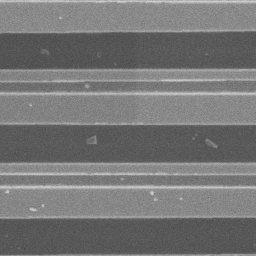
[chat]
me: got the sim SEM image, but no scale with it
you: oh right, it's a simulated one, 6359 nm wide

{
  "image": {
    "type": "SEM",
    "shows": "lines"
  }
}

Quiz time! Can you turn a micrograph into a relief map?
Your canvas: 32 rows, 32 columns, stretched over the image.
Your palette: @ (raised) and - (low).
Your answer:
@@@@@@@@@@@@@@@@@@@@@@@@@@@@@@@@
@@@@@@@@@@@@@@@@@@@@@@@@@@@@@@@@
@@@@@@@@@@@@@@@@@@@@@@@@@@@@@@@@
@@@@@@@@@@@@@@@@@@@@@@@@@@@@@@@@
--------------------------------
--------------------------------
--------------------------------
--------------------------------
--------------------------------
@@@@@@@@@@@@@@@@@@@@@@@@@@@@@@@@
@@@@@@@@@@@@@@@@@@@@@@@@@@@@@@@@
@@@@@@@@@@@@@@@@@@@@@@@@@@@@@@@@
@@@@@@@@@@@@@@@@@@@@@@@@@@@@@@@@
@@@@@@@@@@@@@@@@@@@@@@@@@@@@@@@@
@@@@@@@@@@@@@@@@@@@@@@@@@@@@@@@@
--------@@@@@@@@@@@@@@@@@@@@@@@@
--------------------------------
--------------------------------
--------------------------------
--------------------------------
--------------------------------
@@@@@@@@@@@@@@@@@@@@@@@@@@@@@@@@
@@@@@@@@@@@@@@@@@@@@@@@@@@@@@@@@
@@@@@@@@@@@@@@@@@@@@@@@@@@@@@@@@
@@@@@@@@@@@@@@@@@@@@@@@@@@@@@@@@
@@@@@@@@@@@@@@@@@@@@@@@@@@@@@@@@
@@@@@@@@@@@@@@@@@@@@@@@@@@@@@@@@
--------------------------------
--------------------------------
--------------------------------
--------------------------------
--------------------------------